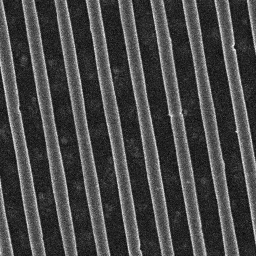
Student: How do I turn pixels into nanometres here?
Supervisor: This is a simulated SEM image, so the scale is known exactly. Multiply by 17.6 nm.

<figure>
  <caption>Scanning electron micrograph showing parallel lines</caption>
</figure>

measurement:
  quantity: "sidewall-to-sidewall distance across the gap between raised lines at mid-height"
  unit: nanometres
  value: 338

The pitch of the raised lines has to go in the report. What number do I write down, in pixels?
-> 31.8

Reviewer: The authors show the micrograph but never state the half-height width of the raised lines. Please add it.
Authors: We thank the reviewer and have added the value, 225 nm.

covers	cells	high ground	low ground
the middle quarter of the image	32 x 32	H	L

HHHLLLLLHHHLLLLLHHHHLLLLHHHLLLLL
LHHLLLLLHHHHLLLLLHHHLLLLLHHHLLLL
LHHHLLLLLHHHLLLLLHHHLLLLLHHHLLLL
LHHHLLLLLHHHLLLLLHHHLLLLLHHHLLLL
LHHHLLLLLHHHLLLLLHHHLLLLLHHHLLLL
LHHHLLLLLHHHLLLLLHHHLLLLLHHHLLLL
LHHHLLLLLHHHLLLLLHHHLLLLLHHHLLLL
LLHHLLLLLHHHHLLLLLHHHLLLLLHHHLLL
LLHHHLLLLLHHHLLLLLHHHLLLLLHHHLLL
LLHHHLLLLLHHHLLLLLHHHLLLLLHHHLLL
LLHHHLLLLLHHHLLLLLHHHLLLLLHHHLLL
LLHHHLLLLLHHHHLLLLHHHLLLLLHHHLLL
LLHHHLLLLLHHHHLLLLHHHLLLLLHHHLLL
LLLHHLLLLLHHHHLLLLLHHHLLLLLHHHLL
LLLHHHLLLLLHHHLLLLLHHHLLLLLHHHLL
LLLHHHLLLLLHHHLLLLLHHHLLLLLHHHLL
LLLHHHLLLLLHHHLLLLLHHHLLLLLHHHLL
LLLHHHLLLLLHHHHLLLLHHHLLLLLHHHLL
LLLHHHLLLLLLHHHLLLLHHHHLLLLLHHHL
LLLLHHHLLLLLHHHLLLLLHHHLLLLLHHHL
LLLLHHHLLLLLHHHLLLLLHHHLLLLLHHHL
LLLLHHHLLLLLHHHLLLLLHHHLLLLLHHHL
LLLLHHHLLLLLHHHLLLLLHHHLLLLLHHHL
LLLLHHHLLLLLHHHLLLLLHHHLLLLLHHHH
LLLLHHHLLLLLLHHLLLLLHHHHLLLLLHHH
LLLLLHHHLLLLLHHHLLLLHHHHLLLLLHHH
LLLLLHHHLLLLLHHHLLLLLHHHLLLLLHHH
LLLLLHHHLLLLLHHHLLLLLHHHLLLLLHHH
LLLLLHHHLLLLLHHHLLLLLHHHLLLLLHHH
LLLLLHHHLLLLLHHHLLLLLHHHLLLLLLHH
LLLLLHHHHLLLLLHHHLLLLHHHHLLLLLHH
HLLLLHHHHLLLLLHHHLLLLLHHHLLLLLHH